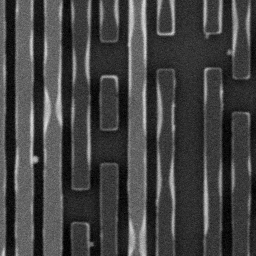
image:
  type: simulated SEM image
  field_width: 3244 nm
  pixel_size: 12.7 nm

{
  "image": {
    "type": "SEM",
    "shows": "groups of lines, slits or small figures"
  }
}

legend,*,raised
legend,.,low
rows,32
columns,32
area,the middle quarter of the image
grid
...***...........***............
...***...........***....***.....
...***...........***...*****....
...***...****....***...*****....
..****...****....***...*****....
..****...****....***....****....
..****...****....***....****....
..****...****...****....****....
..****...****...****....***.....
..****...****...****....***.....
..****...****...****....***.....
..****...****...****....***.....
..****...****...****....***.....
..****...****...****....***.....
..****...****...****....***.....
..****...****...****....***.....
..****..........****....***.....
..****..........****....***.....
..****..........****....***.....
..****..........****....***.....
..****..........****....***.....
..****..........****....***.....
..****..........****....***.....
..****..........****....***.....
..****..........****....***.....
..****...****...****....***.....
..****...****...****....***.....
..****...****...****....***.....
..****...****...****....***.....
..****...****...****....***.....
..****...****...****....***.....
.........****...****....***.....